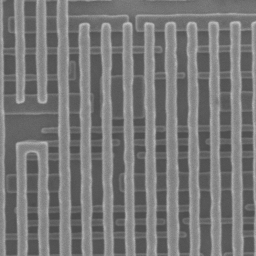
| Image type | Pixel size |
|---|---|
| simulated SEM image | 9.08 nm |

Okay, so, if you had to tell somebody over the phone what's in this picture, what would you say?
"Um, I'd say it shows wiring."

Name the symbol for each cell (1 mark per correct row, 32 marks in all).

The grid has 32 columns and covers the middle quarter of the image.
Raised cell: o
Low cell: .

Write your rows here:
o...oo....oo...oo...ooo..ooo...o
o...oo....oo...oo...ooo..ooo...o
o...oo....oo...oo...oo...ooo...o
o...oo....oo...oo...oo....oo...o
o...oo....oo...oo...oo....oo...o
o...oo....oo...oo...oo....oo...o
o...oo....oo...oo...ooo...oo...o
o...oo....oo...oo...ooo...oo...o
o...oo....oo...oo...ooo...oo...o
o...ooo...oo...oo...ooo...oo...o
o...ooo...oo...oo...ooo...oo...o
o...ooo...oo...oo...ooo...oo...o
o...ooo...oo...oo...ooo...oo...o
o...ooo...oo...oo...ooo...oo...o
o...ooo...oo...oo...ooo...oo...o
o...ooo...oo...oo...ooo...oo...o
o...ooo...oo...oo...ooo...oo...o
o...oo....oo...oo...ooo...oo...o
o...oo....oo...oo...ooo...oo...o
o...ooo...oo...oo...ooo...oo...o
o...ooo...oo...oo...ooo...oo...o
o...ooo...oo...oo...ooo...oo...o
o...ooo...oo...ooo..ooo...oo...o
o...ooo...oo...ooo..ooo...oo...o
o...ooo...oo...ooo..ooo...oo...o
o...ooo...oo...ooo..ooo...oo...o
oo..ooo...oo...oo...ooo...ooo..o
oo..ooo...oo...oo...ooo...ooo..o
oo..ooo...oo...oo...ooo...ooo..o
oo..ooo...oo...ooo..ooo...ooo..o
oo..ooo...oo...ooo..ooo...ooo..o
oo..ooo...oo...ooo..ooo...ooo..o